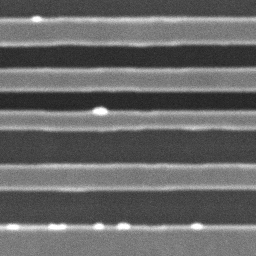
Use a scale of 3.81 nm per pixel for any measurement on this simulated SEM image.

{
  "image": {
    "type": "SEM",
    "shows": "lines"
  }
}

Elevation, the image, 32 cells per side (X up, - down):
--------------------------------
--------------------------------
XXXXXXXXXXXXXXXXXXXXXXXXXXXXXXXX
XXXXXXXXXXXXXXXXXXXXXXXXXXXXXXXX
XXXXXXXXXXXXXXXXXXXXXXXXXXXXXXXX
XXXXXXXX--XXXXXXXXXXXXX---------
--------------------------------
--------------------------------
--------------------------------
XXXXXXXXXXXXXXXXXXXXXXXXXXXXXXXX
XXXXXXXXXXXXXXXXXXXXXXXXXXXXXXXX
--------------------------------
--------------------------------
--------------------------------
XXXXXXXXXXXXXXXXXXXXXXXXXXXXXXXX
XXXXXXXXXXXXXXXXXXXXXXXXXXXXXXXX
--------------------------------
--------------------------------
--------------------------------
--------------------------------
--------------------------------
XXXXXXXXXXXXXXXXXXXXXXXXXXXXXXXX
XXXXXXXXXXXXXXXXXXXXXXXXXXXXXXXX
XXXXXXXXXXXXXXXXXXXXXXXXXXXXXXXX
--------------------------------
--------------------------------
--------------------------------
--------------------------------
XXXXXXXXXXXXXXXXXXXXXXXXXXXXXXXX
XXXXXXXXXXXXXXXXXXXXXXXXXXXXXXXX
XXXXXXXXXXXXXXXXXXXXXXXXXXXXXXXX
XXXXXXXXXXXXXXXXXXXXXXXXXXXXXXXX